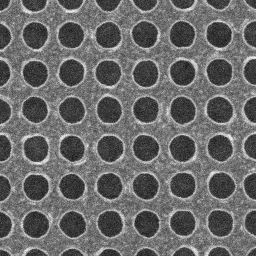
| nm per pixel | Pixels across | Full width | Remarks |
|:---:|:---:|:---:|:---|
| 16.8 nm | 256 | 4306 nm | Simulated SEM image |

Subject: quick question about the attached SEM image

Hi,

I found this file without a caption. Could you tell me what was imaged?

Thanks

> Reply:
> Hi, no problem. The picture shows a regular array of holes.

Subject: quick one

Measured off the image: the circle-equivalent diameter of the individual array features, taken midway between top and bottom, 444 nm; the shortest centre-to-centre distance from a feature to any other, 616 nm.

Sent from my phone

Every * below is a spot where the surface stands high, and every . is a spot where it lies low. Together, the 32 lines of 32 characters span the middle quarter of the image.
.....***......****.....****.....
.....***......***......***......
.....***......***.......**......
.....***......***.......***.....
....*****.....****.....****.....
*..********.*******...**********
********************************
********************************
*..*******..*******...******...*
....*****.....****.....****.....
.....***......***.......***.....
.....***.......**.......**......
.....***......***.......***.....
.....****.....****.....****.....
*...******...******...******...*
********************************
********************************
********************************
....*****.....****....******....
.....***.......**......****.....
.....***.......**.......**......
.....***.......**.......***.....
.....***.......**......****.....
.....****.....****.....****.....
**.*******...****************.**
********************************
********************************
*.********...******...******....
....*****.....****.....****.....
.....***......***.......***.....
.....***.......**.......**......
.....***.......**.......***.....